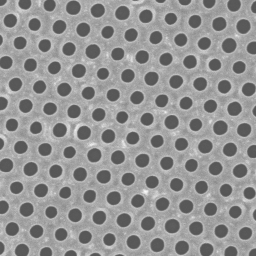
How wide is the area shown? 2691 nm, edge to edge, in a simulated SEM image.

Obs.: a regular array of holes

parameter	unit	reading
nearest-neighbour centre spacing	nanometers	248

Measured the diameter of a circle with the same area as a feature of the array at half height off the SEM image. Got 140 nm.